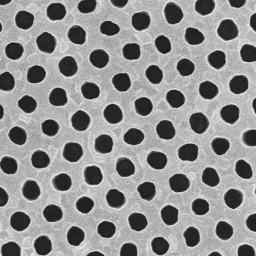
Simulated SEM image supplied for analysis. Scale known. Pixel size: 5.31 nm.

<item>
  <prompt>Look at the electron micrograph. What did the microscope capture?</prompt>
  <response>a regular array of holes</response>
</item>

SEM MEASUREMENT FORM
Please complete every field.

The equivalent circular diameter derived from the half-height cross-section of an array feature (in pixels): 18.5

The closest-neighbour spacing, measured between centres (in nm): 166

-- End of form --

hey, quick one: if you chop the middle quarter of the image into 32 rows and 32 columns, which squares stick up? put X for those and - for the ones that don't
---XXXX---XXXXXXXXXXX--XXXXX----
---XXXXXXXXXXXXXXXXXX---XXXX----
---XXXXXXXXXX---XXXX-----XXXX---
XXXXXXXXXXXX----XXXXX----XXXXXXX
XXXXXXXXXXXX-----XXXXX--XXXXXXXX
XXXXX---XXXXX----XXXXXXXXXXXXXXX
XXXX-----XXXX---XXXXXXXXXXX-XXXX
XXXXX----XXXXXXXXXXXXXXXXX----XX
-XXXX---XXXXXXXXXXX--XXXX-----XX
-XXXXXXXXXXXXXXXXX----XXXX----XX
XXXXXXXXXXX--XXXXX----XXXXX--XXX
XXXXXXXXXX----XXXX----XXXXXXXXXX
XXX---XXXX-----XXXX--XXXXXXXXXXX
XX----XXXX----XXXXXXXXXXXXXXXXX-
XX----XXXXX---XXXXXXXXXX---XXXX-
XX----XXXXXXXXXXXXXXXXX----XXXXX
XXX--XXXXXXXXXXX---XXXX-----XXXX
XXXXXXXXXXXXXXX-----XXX-----XXXX
XXXXXXXX----XXX-----XXXX---XXXXX
XXXXXXXX----XXX----XXXXXXXXXXXXX
----XXXX----XXXXXXXXXXXXXXXXX---
-----XXX----XXXXXXXXXXXXXXXXX---
-----XXXXXXXXXXXXXXXX----XXXX---
----XXXXXXXXXXX-XXXXX-----XXX---
XXXXXXXXXXXXX----XXXX-----XXXXXX
XXXXXXXXXXXXX-----XXXX---XXXXXXX
XXXXX----XXXX-----XXXXXXXXXXXXXX
XXXXX----XXXXX---XXXXXXXXXXX-XXX
--XXX-----XXXXXXXXXXXXXXXX-----X
--XXXX---XXXXXXXXXXX--XXXX-----X
--XXXXXXXXXXXXXXXXX----XXX-----X
-XXXXXXXXXXX--XXXX-----XXXX----X